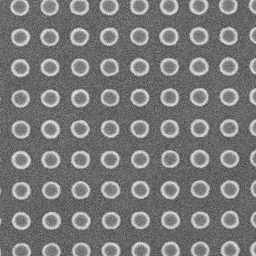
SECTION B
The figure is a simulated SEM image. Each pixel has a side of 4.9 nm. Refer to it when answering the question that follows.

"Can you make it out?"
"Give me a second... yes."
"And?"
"a regular array of raised bodies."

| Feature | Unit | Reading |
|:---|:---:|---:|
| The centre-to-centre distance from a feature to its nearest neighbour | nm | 145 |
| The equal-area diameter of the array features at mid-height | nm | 81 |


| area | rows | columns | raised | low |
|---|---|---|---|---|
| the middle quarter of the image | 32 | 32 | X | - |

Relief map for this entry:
--XXXX----XXX----XXXX---XXXXX---
--XXXX----XXX----XXXX----XXX----
---XX-----XXX-----XX------X-----
--------------------------------
--------------------------------
--------------------------------
--------------------------X-----
--XXXX----XXX----XXXX----XXX----
--XXXX----XXX----XXXX---XXXX----
--XXXX----XXX----XXXX----XXX----
--------------------------------
--------------------------------
--------------------------------
--------------------------------
---XX-----XXX-----XX------X-----
--XXXX----XXXX---XXXX---XXXX----
--XXXX----XXXX---XXXX---XXXX----
---XXX----XXX-----XXX----XXX----
--------------------------------
--------------------------------
--------------------------------
--------------------------------
---XX-----XXX----XXXX----XXX----
--XXXX---XXXXX---XXXX----XXXX---
--XXXX----XXXX---XXXX----XXX----
---XXX----XXX-----XX-----XXX----
--------------------------------
--------------------------------
--------------------------------
--------------------------------
---XXX----XXX----XXXX----XXX----
--XXXX----XXXX---XXXX----XXX----